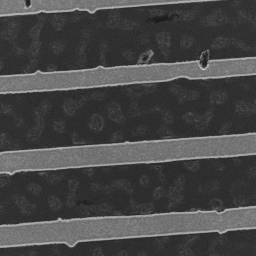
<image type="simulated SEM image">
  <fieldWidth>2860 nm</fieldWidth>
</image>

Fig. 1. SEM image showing one or a few lines or trenches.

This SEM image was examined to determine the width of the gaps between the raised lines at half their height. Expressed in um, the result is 0.654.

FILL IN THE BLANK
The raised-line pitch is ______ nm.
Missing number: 847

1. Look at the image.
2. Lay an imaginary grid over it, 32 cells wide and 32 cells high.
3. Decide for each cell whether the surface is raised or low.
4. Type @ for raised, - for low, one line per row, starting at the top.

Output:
@@@@@@@@@@@@@@@@@@@@------------
@@@@@------@--------------------
--------------------------------
--------------------------------
--------------------------------
--------------------------------
--------------------------------
-------------------------@--@@@@
------------@-@@@@@@@@@@@@@@@@@@
-@@@@@@@@@@@@@@@@@@@@@@@@@@@----
@@@@@@@@@@@@@@@-----------------
@@@-----------------------------
--------------------------------
--------------------------------
--------------------------------
--------------------------------
--------------------------------
----------------------@@@@@@@@@@
--------@@@@@@@@@@@@@@@@@@@@@@@@
@@@@@@@@@@@@@@@@@@@@@@@@@@@@@---
@@@@@@@@@@@@@@------------------
@@------------------------------
--------------------------------
--------------------------------
--------------------------------
--------------------------------
-------------------------@@-@@@@
---------@@@@@@@@@@@@@@@@@@@@@@@
@@@@@@@@@@@@@@@@@@@@@@@@@@@@@@@-
@@@@@@@@@@@@@@@@@@--------------
@@@@----@-----------------------
--------------------------------